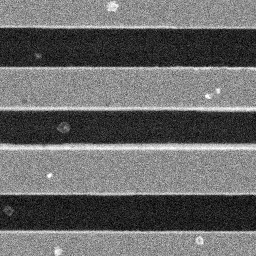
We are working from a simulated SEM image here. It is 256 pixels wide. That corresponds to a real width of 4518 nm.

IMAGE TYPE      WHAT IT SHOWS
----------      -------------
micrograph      lines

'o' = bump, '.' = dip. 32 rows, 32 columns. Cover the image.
oooooooooooooooooooooooooooooooo
oooooooooooooooooooooooooooooooo
oooooooooooooooooooooooooooooooo
................................
................................
................................
................................
................................
oooooooooooooooooooooooooooooooo
oooooooooooooooooooooooooooooooo
oooooooooooooooooooooooooooooooo
oooooooooooooooooooooooooooooooo
oooooooooooooooooooooooooooooooo
.....oo...ooooo...oooooooooooooo
................................
................................
................................
................................
o.......oo..........ooo.oooooo..
oooooooooooooooooooooooooooooooo
oooooooooooooooooooooooooooooooo
oooooooooooooooooooooooooooooooo
oooooooooooooooooooooooooooooooo
oooooooooooooooooooooooooooooooo
................................
................................
................................
................................
................................
oooooooooooooooooooooooooooooooo
oooooooooooooooooooooooooooooooo
oooooooooooooooooooooooooooooooo